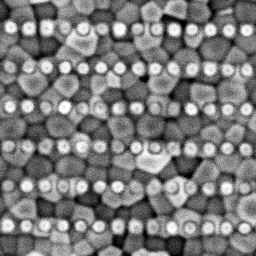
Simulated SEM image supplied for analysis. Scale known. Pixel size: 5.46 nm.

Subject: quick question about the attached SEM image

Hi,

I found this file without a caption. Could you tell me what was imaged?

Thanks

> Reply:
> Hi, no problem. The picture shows a regular array of raised bodies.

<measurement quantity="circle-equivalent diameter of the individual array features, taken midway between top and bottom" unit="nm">56.5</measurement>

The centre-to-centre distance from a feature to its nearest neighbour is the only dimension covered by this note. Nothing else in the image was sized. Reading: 95.6 nm